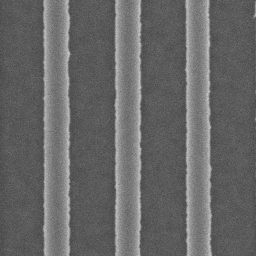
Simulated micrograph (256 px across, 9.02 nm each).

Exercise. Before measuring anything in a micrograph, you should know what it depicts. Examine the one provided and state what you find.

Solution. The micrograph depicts lines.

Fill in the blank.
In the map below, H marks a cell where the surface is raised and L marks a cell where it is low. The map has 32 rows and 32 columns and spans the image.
LLLLLLHHHLLLLLHHHHLLLLLHHHLLLLLL
LLLLLLHHHLLLLLHHHHLLLLLHHHLLLLLL
LLLLLLHHHLLLLLHHHHLLLLLHHHLLLLLL
LLLLLLHHHLLLLLHHHHLLLLLHHHLLLLLL
LLLLLLHHHLLLLLHHHHLLLLLHHHLLLLLL
LLLLLLHHHLLLLLHHHHLLLLLHHHLLLLLL
LLLLLLHHHLLLLLHHHHLLLLLHHHLLLLLL
LLLLLLHHHLLLLLHHHHLLLLLHHHLLLLLL
LLLLLLHHLLLLLLHHHHLLLLLHHHLLLLLL
LLLLLLHHHLLLLLHHHHLLLLLHHHLLLLLL
LLLLLLHHHLLLLLHHHHLLLLLHHHLLLLLL
LLLLLLHHHLLLLLHHHHLLLLLHHHLLLLLL
LLLLLLHHHLLLLLHHHHLLLLLHHHLLLLLL
LLLLLLHHHLLLLLHHHHLLLLLHHHLLLLLL
LLLLLLHHHLLLLLHHHHLLLLLHHHLLLLLL
LLLLLLHHHLLLLLHHHHLLLLLHHHLLLLLL
LLLLLLHHHLLLLLHHHHLLLLLHHHLLLLLL
LLLLLLHHHLLLLLHHHHLLLLLHHHLLLLLL
LLLLLLHHHLLLLLHHHHLLLLLHHHLLLLLL
LLLLLLHHHLLLLLHHHHLLLLLHHHLLLLLL
LLLLLLHHHLLLLLHHHHLLLLLHHHLLLLLL
LLLLLLHHHLLLLLHHHHLLLLLHHHLLLLLL
LLLLLLHHHLLLLLHHHHLLLLLHHHLLLLLL
LLLLLLHHHLLLLLHHHLLLLLLHHHLLLLLL
LLLLLLHHHLLLLLLHHHLLLLLHHHLLLLLL
LLLLLLHHHLLLLLHHHHLLLLLHHHLLLLLL
LLLLLLHHHLLLLLHHHHLLLLLHHHLLLLLL
LLLLLLHHHLLLLLHHHHLLLLLHHHLLLLLL
LLLLLLHHHLLLLLHHHHLLLLLHHHLLLLLL
LLLLLLHHHLLLLLHHHLLLLLLHHHLLLLLL
LLLLLLHHHLLLLLHHHLLLLLLHHHLLLLLL
LLLLLLHHHLLLLLHHHLLLLLLHHHLLLLLL